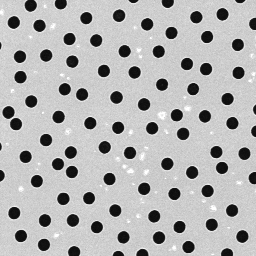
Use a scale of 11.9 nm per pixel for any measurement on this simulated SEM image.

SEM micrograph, a regular array of holes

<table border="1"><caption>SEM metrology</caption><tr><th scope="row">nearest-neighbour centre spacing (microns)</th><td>0.29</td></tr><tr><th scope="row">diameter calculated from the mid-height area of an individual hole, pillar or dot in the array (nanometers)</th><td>146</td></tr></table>